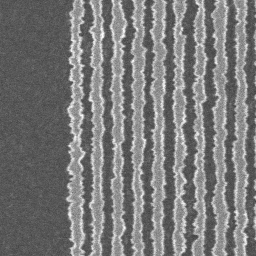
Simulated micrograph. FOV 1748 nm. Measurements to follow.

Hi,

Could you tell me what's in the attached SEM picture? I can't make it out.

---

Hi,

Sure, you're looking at parallel lines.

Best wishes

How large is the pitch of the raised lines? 140 nm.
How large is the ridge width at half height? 68.3 nm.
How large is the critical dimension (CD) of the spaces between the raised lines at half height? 74.3 nm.